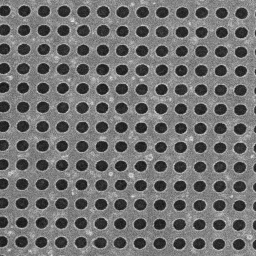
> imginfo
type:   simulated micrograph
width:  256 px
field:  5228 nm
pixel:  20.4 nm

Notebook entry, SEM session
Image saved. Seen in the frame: a regular array of holes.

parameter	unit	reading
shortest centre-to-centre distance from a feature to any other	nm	390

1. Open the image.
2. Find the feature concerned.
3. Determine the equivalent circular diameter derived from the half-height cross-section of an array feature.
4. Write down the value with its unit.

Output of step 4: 245 nanometres